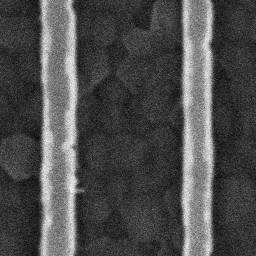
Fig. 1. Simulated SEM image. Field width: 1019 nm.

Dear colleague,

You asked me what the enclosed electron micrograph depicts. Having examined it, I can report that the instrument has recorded one or a few lines or trenches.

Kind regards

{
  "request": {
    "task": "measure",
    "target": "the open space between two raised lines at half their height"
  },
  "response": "452 nm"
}